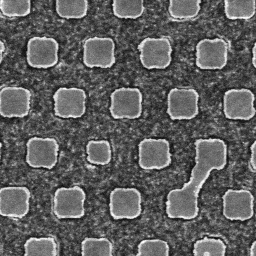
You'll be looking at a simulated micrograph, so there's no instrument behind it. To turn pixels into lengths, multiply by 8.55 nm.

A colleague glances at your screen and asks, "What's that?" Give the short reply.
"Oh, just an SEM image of a regular array of raised bodies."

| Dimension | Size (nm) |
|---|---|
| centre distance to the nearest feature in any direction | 483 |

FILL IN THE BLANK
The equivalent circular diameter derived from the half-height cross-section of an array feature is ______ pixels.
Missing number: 32.6